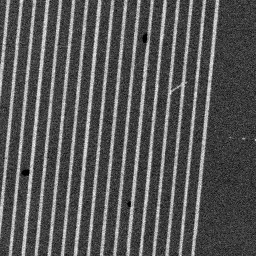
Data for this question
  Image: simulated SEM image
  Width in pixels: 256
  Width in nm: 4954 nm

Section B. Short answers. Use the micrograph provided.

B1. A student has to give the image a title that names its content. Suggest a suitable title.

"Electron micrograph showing parallel lines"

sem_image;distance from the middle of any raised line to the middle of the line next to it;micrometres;0.252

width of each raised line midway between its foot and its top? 38.5 nm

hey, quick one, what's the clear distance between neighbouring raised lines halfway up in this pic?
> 10.6 px